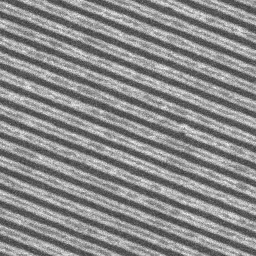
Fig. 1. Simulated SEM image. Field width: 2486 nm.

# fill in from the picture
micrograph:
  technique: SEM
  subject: parallel lines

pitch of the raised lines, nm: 155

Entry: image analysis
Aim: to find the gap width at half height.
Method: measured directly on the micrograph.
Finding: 93.7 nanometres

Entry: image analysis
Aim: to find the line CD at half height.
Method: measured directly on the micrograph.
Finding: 67.7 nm